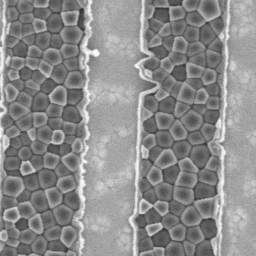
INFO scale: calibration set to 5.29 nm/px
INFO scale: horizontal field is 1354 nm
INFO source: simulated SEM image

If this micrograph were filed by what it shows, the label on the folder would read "one or a few lines or trenches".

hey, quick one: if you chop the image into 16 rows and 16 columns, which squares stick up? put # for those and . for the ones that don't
######...#####..
######...#####..
######...#####..
######...#####..
#####....#####..
######...#####..
#####....#####..
#####....#####..
#####....#####..
#####....#####..
#####....#####..
#####....#####..
#####...######..
#####...######..
#####...######..
#####...######..